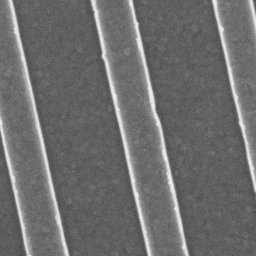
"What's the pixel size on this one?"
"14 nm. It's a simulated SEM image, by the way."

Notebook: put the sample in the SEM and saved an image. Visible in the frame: one or a few lines or trenches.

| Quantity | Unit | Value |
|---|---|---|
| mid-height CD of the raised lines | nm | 529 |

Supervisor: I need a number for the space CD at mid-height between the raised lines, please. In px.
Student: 79.6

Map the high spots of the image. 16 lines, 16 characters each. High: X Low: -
X-----XX-----XXX
X-----XXX-----XX
X-----XXX-----XX
X------XX-----XX
XX-----XX-----XX
XX-----XX------X
XX-----XXX-----X
XX-----XXX-----X
XXX-----XX-----X
XXX-----XX-----X
-XX-----XXX-----
-XX-----XXX-----
-XX------XX-----
-XXX-----XX-----
-XXX-----XX-----
--XX-----XXX----